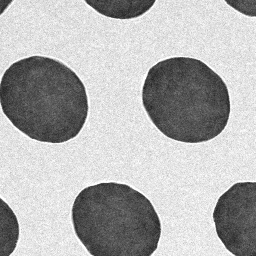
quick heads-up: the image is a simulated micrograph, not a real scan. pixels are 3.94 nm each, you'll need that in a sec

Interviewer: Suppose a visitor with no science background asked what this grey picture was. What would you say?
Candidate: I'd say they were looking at holes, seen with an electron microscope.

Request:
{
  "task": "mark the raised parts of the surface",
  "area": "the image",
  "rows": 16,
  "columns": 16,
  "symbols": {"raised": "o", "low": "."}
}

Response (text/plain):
oooooo...oooooo.
oooooooooooooooo
oooooooooooooooo
oooooooooooooooo
.....oooo....ooo
.....oooo.....oo
.....oooo.....oo
o....oooo.....oo
oo...ooooo...ooo
oooooooooooooooo
oooooooooooooooo
oooooo..ooooooo.
ooooo....ooooo..
.oooo.....ooo...
.oooo.....oooo..
.oooo.....oooo..